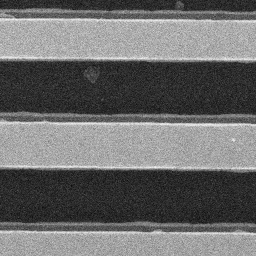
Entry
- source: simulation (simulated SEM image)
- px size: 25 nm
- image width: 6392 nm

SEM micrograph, lines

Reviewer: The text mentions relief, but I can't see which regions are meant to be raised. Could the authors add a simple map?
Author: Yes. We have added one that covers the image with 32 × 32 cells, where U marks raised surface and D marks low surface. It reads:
DDDDDDDDDDDDDDDDDDDDDDDDDDDDDDDD
DDDDDDDDDDDDDDDDDDDDDDDDDDDDDDDD
UUUUUUUUUUUUUUUDDDDDDDDDDDDDDDDD
UUUUUUUUUUUUUUUUUUUUUUUUUUUUUUUU
UUUUUUUUUUUUUUUUUUUUUUUUUUUUUUUU
UUUUUUUUUUUUUUUUUUUUUUUUUUUUUUUU
UUUUUUUUUUUUUUUUUUUUUUUUUUUUUUUU
DDDDDDDDDDDDDDDDDDDDDDDDDDDDDDDD
DDDDDDDDDDDDDDDDDDDDDDDDDDDDDDDD
DDDDDDDDDDDDDDDDDDDDDDDDDDDDDDDD
DDDDDDDDDDDDDDDDDDDDDDDDDDDDDDDD
DDDDDDDDDDDDDDDDDDDDDDDDDDDDDDDD
DDDDDDDDDDDDDDDDDDDDDDDDDDDDDDDD
DDDDDDDDDDDDDDDDDDDDDDDDDDDDDDDD
DDDDDDDDDDDDDDDDDDDDDDDDDDDDDDDD
UUUUUUUUUUUUUUUUUUUUUUDDDDDDDDDD
UUUUUUUUUUUUUUUUUUUUUUUUUUUUUUUU
UUUUUUUUUUUUUUUUUUUUUUUUUUUUUUUU
UUUUUUUUUUUUUUUUUUUUUUUUUUUUUUUU
UUUUUUUUUUUUUUUUUUUUUUUUUUUUUUUU
UUUUUUUUUUUUUUUUUUUUUUUUUUUUUUUU
DDDDDDDDDDDDDDDDDDDDDDDDDDDDDDDD
DDDDDDDDDDDDDDDDDDDDDDDDDDDDDDDD
DDDDDDDDDDDDDDDDDDDDDDDDDDDDDDDD
DDDDDDDDDDDDDDDDDDDDDDDDDDDDDDDD
DDDDDDDDDDDDDDDDDDDDDDDDDDDDDDDD
DDDDDDDDDDDDDDDDDDDDDDDDDDDDDDDD
DDDDDDDDDDDDDDDDDDDDDDDDDDDDDDDD
DDDDDDDDDDDDDDDDDDDDDDDDDDDDDDDD
UUUUUUUUUUUUUUUUUUUUUUUUUUUUUUUU
UUUUUUUUUUUUUUUUUUUUUUUUUUUUUUUU
UUUUUUUUUUUUUUUUUUUUUUUUUUUUUUUU